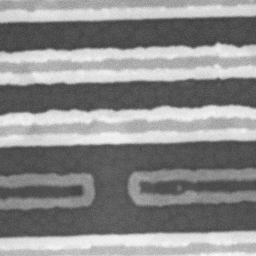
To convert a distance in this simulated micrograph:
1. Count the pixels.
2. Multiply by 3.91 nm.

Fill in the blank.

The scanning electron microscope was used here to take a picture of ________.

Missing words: one or a few lines or trenches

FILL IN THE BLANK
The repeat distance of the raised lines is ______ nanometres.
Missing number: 244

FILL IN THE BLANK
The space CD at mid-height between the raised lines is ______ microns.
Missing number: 0.152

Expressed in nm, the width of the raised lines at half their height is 92.4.